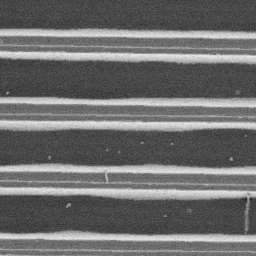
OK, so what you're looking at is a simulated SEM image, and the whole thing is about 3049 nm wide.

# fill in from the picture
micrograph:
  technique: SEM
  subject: lines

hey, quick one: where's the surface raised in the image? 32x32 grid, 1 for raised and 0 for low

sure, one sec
00000000000000000000000000000000
00000000000000000000000000000000
00000000000000000000000000000000
00000000000000000000000000000000
11111111111111111111111111111000
11111111111111111111111111111111
11111111111111111111111111111111
00000000000000000000000000000000
00000000000000000000000000000000
00000000000000000000000000000000
00000000000000000000000000000000
00000000000000000000000000000000
00000000000000000000000000000000
11111111111111111111111111111111
11111111111111111111111111111111
01111111101111111111111111111111
00000000000000000000000000000000
00000000000000000000000000000000
00000000000000000000000000000000
00000000000000000000000000000000
00000000000000000000000000000000
11111111111111111111111111000000
11111111111111111111111111111111
11111111111111111111111111111111
00000000000000000000000000000000
00000000000000000000000000000000
00000000000000000000000000000000
00000000000000000000000000000000
00000000000000000000000000000000
00000000000000000000000000000000
11111111111111111111111111111111
11111111111111111111111111111111